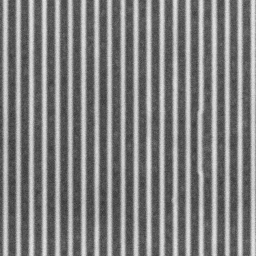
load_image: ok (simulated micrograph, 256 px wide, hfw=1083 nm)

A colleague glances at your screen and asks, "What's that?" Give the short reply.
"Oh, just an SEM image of parallel lines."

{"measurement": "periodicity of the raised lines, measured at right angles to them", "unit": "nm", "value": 55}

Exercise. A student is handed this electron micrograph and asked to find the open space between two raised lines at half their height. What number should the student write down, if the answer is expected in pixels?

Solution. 8.87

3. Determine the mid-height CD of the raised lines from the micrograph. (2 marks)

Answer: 16.4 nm